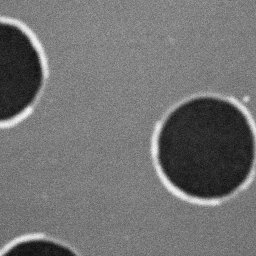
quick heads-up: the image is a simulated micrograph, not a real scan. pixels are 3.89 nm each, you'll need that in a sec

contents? holes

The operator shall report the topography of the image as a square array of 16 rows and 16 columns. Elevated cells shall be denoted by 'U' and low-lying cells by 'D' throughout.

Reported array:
UUUUUUUUUUUUUUUU
DUUUUUUUUUUUUUUU
DDUUUUUUUUUUUUUU
DDUUUUUUUUUUUUUU
DDDUUUUUUUUUUUUU
DDDUUUUUUUUUUUUU
DDUUUUUUUUUDDDUU
DUUUUUUUUUDDDDDU
UUUUUUUUUUDDDDDD
UUUUUUUUUUDDDDDD
UUUUUUUUUUDDDDDD
UUUUUUUUUUUDDDDU
UUUUUUUUUUUUUUUU
UUUUUUUUUUUUUUUU
UUUUUUUUUUUUUUUU
UDDDUUUUUUUUUUUU